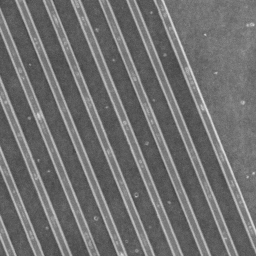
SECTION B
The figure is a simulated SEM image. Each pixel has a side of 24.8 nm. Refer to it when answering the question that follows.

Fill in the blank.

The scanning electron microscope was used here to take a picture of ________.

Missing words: parallel lines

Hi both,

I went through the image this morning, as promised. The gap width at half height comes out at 445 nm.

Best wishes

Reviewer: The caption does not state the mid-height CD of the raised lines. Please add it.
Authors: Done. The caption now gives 7.54 pixels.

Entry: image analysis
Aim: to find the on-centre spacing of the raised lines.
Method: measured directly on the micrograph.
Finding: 637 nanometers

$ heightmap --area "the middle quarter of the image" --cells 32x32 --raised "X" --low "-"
--X------X------X-----XX-----XX-
--XX-----XX-----XX-----XX-----XX
--XX-----XX-----XX-----XX-----XX
---XX-----XX-----XX-----XX----XX
---XX-----XX-----XX-----XX-----X
----XX-----X------XX----XX-----X
----XX-----XX-----XX-----XX-----
----XX-----XX-----XX-----XX-----
-----XX-----XX-----XX-----XX----
-----XX-----XX-----XX-----XX----
X-----XX-----XX-----XX----XX----
X-----XX-----XX-----XX-----XX---
X-----XX-----XX-----XX-----XX---
XX-----XX-----XX-----XX-----XX--
XX-----XX-----XX-----XX-----XX--
-XX-----XX-----XX-----XX----XX--
-XX-----XX-----XX-----XX-----XX-
-XX-----XX-----XX-----XX-----XX-
--XX-----XX-----XX-----XX-----XX
--XX-----XX-----XX-----XX-----XX
---XX-----XX-----XX-----XX----XX
---XX-----XX-----XX-----XX-----X
---XX-----XX-----XX-----XX-----X
----XX-----XX-----XX-----XX-----
----XX-----XX-----XX-----XX-----
-----XX-----XX-----X------XX----
-----XX-----XX-----XX-----XX----
X----XX-----XX-----XX-----XX----
X-----XX-----XX-----XX-----XX---
X-----XX-----XX-----XX-----XX---
XX-----XX-----XX-----X------XX--
XX-----XX-----XX-----XX-----XX--